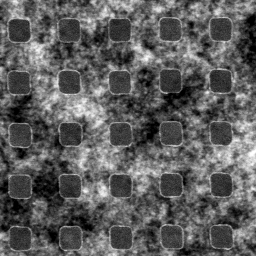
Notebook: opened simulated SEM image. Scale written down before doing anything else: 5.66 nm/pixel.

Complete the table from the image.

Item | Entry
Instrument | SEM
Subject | a regular array of raised bodies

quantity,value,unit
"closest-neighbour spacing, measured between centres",284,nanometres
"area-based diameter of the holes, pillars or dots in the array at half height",145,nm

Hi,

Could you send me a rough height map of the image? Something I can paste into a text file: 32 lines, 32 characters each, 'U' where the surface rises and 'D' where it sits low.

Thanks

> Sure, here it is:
DDDDDDDDDDDDDDDDDDDDDDDDDDDDDDDD
DDDDDDDDDDDDDDDDDDDDDDDDDDDDDDDD
DUUDDDDDUUDDDDUUDDDDUUDDDDUUUDDD
DUUUDDDUUUDDDDUUDDDUUUUDDDUUUDDD
DUUUDDDUUUDDDDUUDDDDUUUDDDUUUDDD
DDDDDDDDDDDDDDDDDDDDDDDDDDDDDDDD
DDDDUDDDDDDDDDDDDDDDDDDDDDDDDDDD
DDDDDDDDDDDDDDDDDDDDDDDDDDDDDDDD
DDDDDDDDDDDDDDDDDDDDDDDDDDDDDDDD
DUUUDDDUUUDDDDUUDDDDUUUDDDUUUDDD
DUUUDDDUUUDDDDUUDDDDUUUDDDUUUDDD
DUUUDDDDUUDDDDUUDDDDUUDDDDDUUDDD
DDDDDDDDDDDDDDDDDDDDDDDDDDDDDDDD
DDDDDDDDDDDDDDDDDDDDDDDDDDDDDDDD
DDDDDDDDDDDDDDDDDDDDDDDDDDDDDDDD
DDUDDDDDUUDDDDUUDDDDUUDDDDUUUDDD
DUUUDDDUUUDDDDUUDDDDUUUDDDUUUDDD
DUUUDDDUUUDDDDUUDDDDUUUDDDUUUDDD
DDDDDDDDDDDDDDDDDDDDDDDDDDDDDDDD
DDDDDDDDDDDDDDDDDDDDDDDDDDDDDDDD
DDDDDDDDDDDDDDDDDDDDDDDDDDDDDDDD
DDDDDDDDDDDDDDDDDDDDDDDDDDDDDDDD
DUUUDDDUUUDDDDUUDDDDUUUDDDUUUDDD
DUUUDDDUUUDDDDUUDDDDUUUDDDUUUDDD
DUUUDDDDUUDDDDUUDDDDDUDDDDDUUDDD
DDDDDDDDDDDDDDDDDDDDDDDDDDDDDDDD
DDDDDDDDDDDDDDDDDDDDDDDDDDDDDDDD
DDDDDDDDDDDDDDDDDDDDDDDDDDDDDDDD
DUUDDDDDUUDDDDUUDDDDUUUDDDUUUDDD
DUUUDDDDUUDDDDUUUDDDUUUDDDUUUDDD
DUUUDDDDUUDDDDUUUDDDUUUDDDUUUDDD
DDDDDDDDDDDDDDDDDDDDDDDDDDDDDDDD